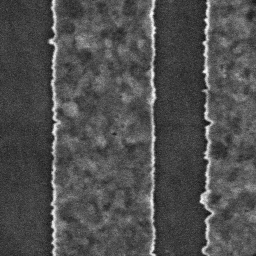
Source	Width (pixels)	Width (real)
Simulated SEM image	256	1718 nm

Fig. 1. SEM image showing one or a few lines or trenches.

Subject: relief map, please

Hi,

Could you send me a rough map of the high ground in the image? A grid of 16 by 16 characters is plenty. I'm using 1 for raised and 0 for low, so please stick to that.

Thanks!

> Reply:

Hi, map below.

0001111111000111
0001111111000111
0001111111000111
0001111111000111
0001111111000111
0001111111000111
0001111111000111
0001111111000111
0001111111000111
0001111111000111
0001111111000111
0001111111000111
0001111111000111
0001111111000111
0001111111000111
0001111111000111